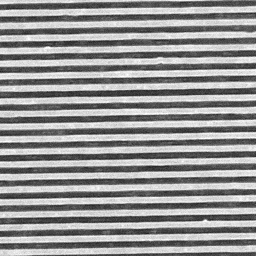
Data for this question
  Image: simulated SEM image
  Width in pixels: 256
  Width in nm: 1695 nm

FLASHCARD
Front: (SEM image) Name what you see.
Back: parallel lines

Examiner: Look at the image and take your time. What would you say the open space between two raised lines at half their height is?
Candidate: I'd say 43.9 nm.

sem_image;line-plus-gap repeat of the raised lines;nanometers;83.4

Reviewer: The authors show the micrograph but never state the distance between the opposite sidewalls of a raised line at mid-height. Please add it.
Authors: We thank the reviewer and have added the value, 38.1 nanometers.